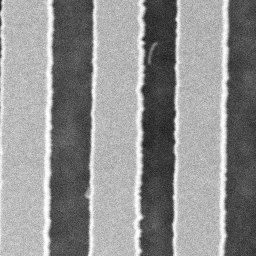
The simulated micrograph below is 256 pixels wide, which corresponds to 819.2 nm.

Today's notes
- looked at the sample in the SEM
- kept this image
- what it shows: lines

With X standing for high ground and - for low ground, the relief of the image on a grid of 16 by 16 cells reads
XXX---XXX--XXX--
XXX---XXX--XXX--
XXX---XXX--XXX--
XXX---XXX--XXX--
XXX---XXX--XXX--
XXX---XXX--XXX--
XXX---XXX--XXX--
XXX---XXX--XXX--
XXX---XXX--XXX--
XXX---XXX--XXX--
XXX---XXX--XXX--
XXX---XXX--XXX--
XXX---XXX--XXX--
XXX---XXX--XXX--
XXX---XXX--XXX--
XXX---XXX--XXX--